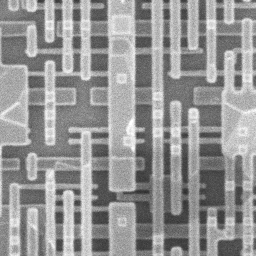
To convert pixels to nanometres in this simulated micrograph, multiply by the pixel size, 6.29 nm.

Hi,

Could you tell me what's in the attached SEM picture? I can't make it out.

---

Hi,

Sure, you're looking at wiring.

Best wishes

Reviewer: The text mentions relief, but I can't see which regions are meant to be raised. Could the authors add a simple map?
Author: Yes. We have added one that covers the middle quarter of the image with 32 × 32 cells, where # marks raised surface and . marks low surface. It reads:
##..##.....#######....###..##...
##..##.....#######....###..##...
....##.....#######....###..##...
....##.....######.....###..##...
...........######.....###.......
...........######.....###.......
...........######.....###.......
...........######.....###.......
...........######.....###.......
...........#######....###..##...
...........#######....###..##...
...........#######....###..##..#
...........######.....###..##..#
...........######.....###..##..#
...........######.....###..##..#
...........#######....###..##..#
...........#######....###..##..#
.....##....#######....###..##..#
.....##....#######....###..##..#
.....##....#######....###..##..#
.....##....#######....###..##..#
.....##....#######....###..##..#
....###....#######....###..##..#
....###....#######....###..##..#
.....##....#######....###..##..#
.....##....#######....###..##..#
.....##....#######....###..##..#
.....##....#######....###..##..#
....###....#######....###..##..#
....###....#######....###..##..#
....###....#######....###..##..#
....###.....#####.....###..##..#